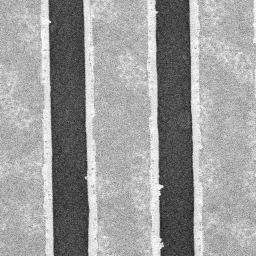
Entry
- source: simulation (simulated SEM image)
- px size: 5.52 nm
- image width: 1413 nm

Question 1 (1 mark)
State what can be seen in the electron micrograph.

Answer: one or a few lines or trenches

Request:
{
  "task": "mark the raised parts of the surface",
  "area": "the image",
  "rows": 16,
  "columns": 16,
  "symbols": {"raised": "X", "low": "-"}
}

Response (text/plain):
XXX--XXXXX--XXXX
XXX--XXXXX--XXXX
XXX---XXXX--XXXX
XXX--XXXXX--XXXX
XXX---XXXX--XXXX
XXX---XXXX--XXXX
XXX---XXXX--XXXX
XXX---XXXX--XXXX
XXX---XXXX--XXXX
XXX---XXXX--XXXX
XXX---XXXX--XXXX
XXX---XXXX--XXXX
XXX---XXXX--XXXX
XXX---XXXX--XXXX
XXX---XXXX--XXXX
XXX---XXXX--XXXX